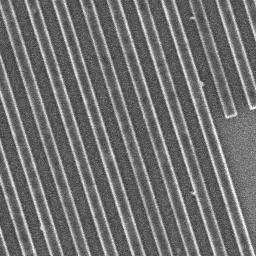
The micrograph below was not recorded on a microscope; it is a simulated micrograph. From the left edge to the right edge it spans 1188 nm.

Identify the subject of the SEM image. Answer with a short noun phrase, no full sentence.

parallel lines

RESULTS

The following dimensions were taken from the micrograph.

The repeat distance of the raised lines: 121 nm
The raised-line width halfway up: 0.0526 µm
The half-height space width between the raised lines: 0.0692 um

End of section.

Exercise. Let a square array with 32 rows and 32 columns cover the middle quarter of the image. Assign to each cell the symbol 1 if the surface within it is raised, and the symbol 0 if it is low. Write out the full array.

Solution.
00111000011100001110000111000011
00011100011100001110000111000011
00011100001110000111000011000011
00011100001110000111000011100001
00011100001110000111000011100001
00001110000111000011100011100001
00001110000111000011100001110001
10000110000111000011100001110000
10000111000011100001110001110000
10000111000011100001110000110000
11000011000011100001110000111000
11000011100001110001110000111000
11000011100001110000111000011000
11100001100001110000111000011100
11100001110000111000111000011100
11100001110000111000011100001100
01110000110000111000011100001110
01110000111000111000011100001110
01110000111000011100001110000110
00111000111000011100001110000111
00111000011100011100001110000111
00111000011100001110000111000011
00111000011100001110000111000011
00011100011100001110000111000011
00011100001110000111000011100011
00011100001110000111000011100001
00001110001110000111000011100001
00001110000111000011100001100001
00001110000111000011100001110000
10000111000111000011100001110000
10000111000011100001110001110000
10000111000011100001110000111000